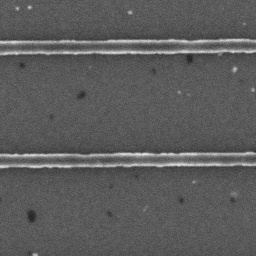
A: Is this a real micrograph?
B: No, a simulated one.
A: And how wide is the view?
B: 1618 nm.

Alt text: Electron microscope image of lines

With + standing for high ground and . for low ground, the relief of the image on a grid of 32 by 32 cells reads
................................
................................
................................
................................
................................
++++++++++++++++++++++++++++++++
++++++++++++++++++++++++++++++++
................................
................................
................................
................................
................................
................................
................................
................................
................................
................................
................................
................................
++++++++++++++++++++++++++++++++
++++++++++++++++++++++++++++++++
................................
................................
................................
................................
................................
................................
................................
................................
................................
................................
................................